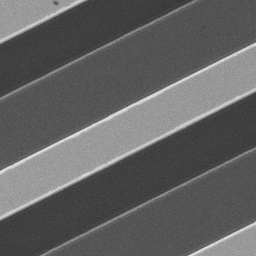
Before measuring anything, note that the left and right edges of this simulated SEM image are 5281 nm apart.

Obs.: lines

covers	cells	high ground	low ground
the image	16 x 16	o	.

oooo.......ooooo
oo.......ooooooo
.......ooooooooo
.....ooooooooooo
...ooooooooooooo
.ooooooooooooooo
oooooooooooooo..
oooooooooooo....
oooooooooo......
oooooooo.......o
oooooo.......ooo
oooo.......ooooo
ooo......ooooooo
o.......oooooooo
......oooooooooo
....oooooooooooo